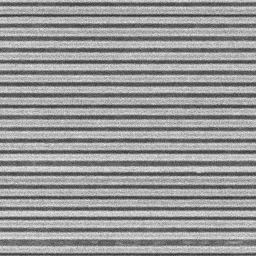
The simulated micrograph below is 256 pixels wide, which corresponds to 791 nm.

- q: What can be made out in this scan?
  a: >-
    parallel lines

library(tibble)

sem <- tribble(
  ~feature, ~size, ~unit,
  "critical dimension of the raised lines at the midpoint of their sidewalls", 20.8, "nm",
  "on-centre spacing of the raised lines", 35.2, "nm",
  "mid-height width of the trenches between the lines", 15.4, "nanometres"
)